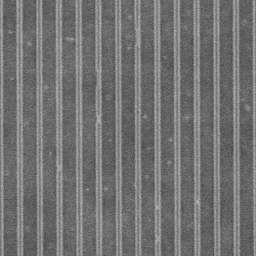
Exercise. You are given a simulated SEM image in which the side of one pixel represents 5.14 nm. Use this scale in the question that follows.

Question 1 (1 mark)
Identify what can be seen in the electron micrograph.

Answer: parallel lines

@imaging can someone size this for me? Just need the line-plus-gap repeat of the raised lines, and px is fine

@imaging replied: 19.7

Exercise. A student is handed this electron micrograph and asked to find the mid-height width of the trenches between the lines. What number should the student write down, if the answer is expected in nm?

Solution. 82.2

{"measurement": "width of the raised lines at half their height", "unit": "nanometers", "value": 19.3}